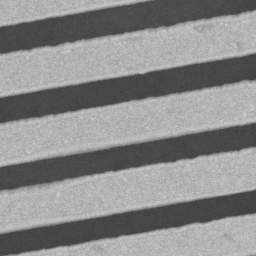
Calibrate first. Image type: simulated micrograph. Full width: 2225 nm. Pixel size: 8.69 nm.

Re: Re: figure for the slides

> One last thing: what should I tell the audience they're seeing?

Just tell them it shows lines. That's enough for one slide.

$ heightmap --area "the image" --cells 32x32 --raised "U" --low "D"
UUUUUUUUUUUUUUUUDDDDDDDDDDDDDDDD
UUUUUUUUUUDDDDDDDDDDDDDDDDDDDDDU
UUUUUDDDDDDDDDDDDDDDDDDDDDUUUUUU
DDDDDDDDDDDDDDDDDDDDUUUUUUUUUUUU
DDDDDDDDDDDDDDUUUUUUUUUUUUUUUUUU
DDDDDDDDUUUUUUUUUUUUUUUUUUUUUUUU
DDUUUUUUUUUUUUUUUUUUUUUUUUUUUUUU
UUUUUUUUUUUUUUUUUUUUUUUUUUUDDDDD
UUUUUUUUUUUUUUUUUUUUUDDDDDDDDDDD
UUUUUUUUUUUUUUUUDDDDDDDDDDDDDDDD
UUUUUUUUUDDDDDDDDDDDDDDDDDDDDUUU
UUUUDDDDDDDDDDDDDDDDDDDDUUUUUUUU
DDDDDDDDDDDDDDDDDDUUUUUUUUUUUUUU
DDDDDDDDDDDDUUUUUUUUUUUUUUUUUUUU
DDDDDDUUUUUUUUUUUUUUUUUUUUUUUUUU
UUUUUUUUUUUUUUUUUUUUUUUUUUUUUUUD
UUUUUUUUUUUUUUUUUUUUUUUUUDDDDDDD
UUUUUUUUUUUUUUUUUUUDDDDDDDDDDDDD
UUUUUUUUUUUUUDDDDDDDDDDDDDDDDDDU
UUUUUUUDDDDDDDDDDDDDDDDDDDUUUUUU
UUDDDDDDDDDDDDDDDDDDUUUUUUUUUUUU
DDDDDDDDDDDDDUUUUUUUUUUUUUUUUUUU
DDDDDDDDUUUUUUUUUUUUUUUUUUUUUUUU
DDDUUUUUUUUUUUUUUUUUUUUUUUUUUUUU
UUUUUUUUUUUUUUUUUUUUUUUUUUUDDDDD
UUUUUUUUUUUUUUUUUUUUUDDDDDDDDDDD
UUUUUUUUUUUUUUUUDDDDDDDDDDDDDDDD
UUUUUUUUUUDDDDDDDDDDDDDDDDDUUUUU
UUUDDDDDDDDDDDDDDDDDDUUUUUUUUUUU
DDDDDDDDDDDDDDDDUUUUUUUUUUUUUUUU
DDDDDDDDDDUUUUUUUUUUUUUUUUUUUUUU
DDDUUUUUUUUUUUUUUUUUUUUUUUUUUUUU